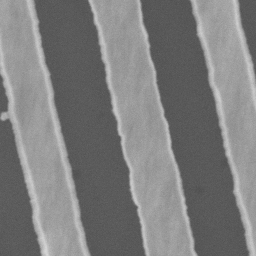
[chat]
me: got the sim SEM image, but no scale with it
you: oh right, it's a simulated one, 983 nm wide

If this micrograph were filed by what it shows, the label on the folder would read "lines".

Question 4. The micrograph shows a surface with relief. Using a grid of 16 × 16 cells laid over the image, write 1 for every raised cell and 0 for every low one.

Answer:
1100001110001110
1100001110001110
1110001110000110
1110001110000111
1110000111000111
1110000111000111
0110000111000011
0111000111000011
0111000111100011
0111000011100011
0011000011100011
0011100011100001
0011100011110001
0011100001110001
0011100001110001
0001100001110000